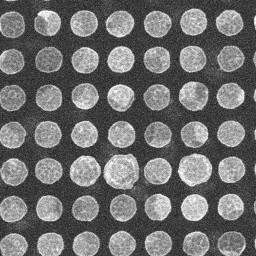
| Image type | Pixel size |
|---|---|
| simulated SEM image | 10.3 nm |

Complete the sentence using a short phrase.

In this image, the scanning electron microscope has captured a regular array of raised bodies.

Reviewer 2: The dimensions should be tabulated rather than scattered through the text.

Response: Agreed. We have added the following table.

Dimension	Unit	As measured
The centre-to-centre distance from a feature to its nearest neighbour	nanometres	373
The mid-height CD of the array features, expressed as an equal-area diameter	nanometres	268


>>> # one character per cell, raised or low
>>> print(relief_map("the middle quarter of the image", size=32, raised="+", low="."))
..++++++...++++++....+++++....++
...++++.....++++......+++.....++
................................
................................
................................
....+++......++.......+++.....++
...+++++....+++++....+++++...+++
..++++++...++++++...++++++...+++
..++++++...++++++...++++++...+++
..++++++...++++++...++++++...+++
...++++.....++++.....+++++....++
.............++.................
................................
................................
....++.......++.................
...++++.....+++++....+++++....++
..++++++...++++++....+++++....++
..++++++...+++++++..+++++++...++
..++++++...+++++++..+++++++...++
...+++++....+++++....+++++....++
....++.......+++......+++......+
................................
................................
....+++.....++++++............++
...+++++...+++++++...+++++...+++
..+++++++.+++++++++..+++++...+++
..+++++++.++++++++..+++++++..+++
..+++++++.++++++++..+++++++..+++
..++++++..++++++++...+++++...+++
...+++++...+++++++....+++.....++
............+++++...............
.................++.............